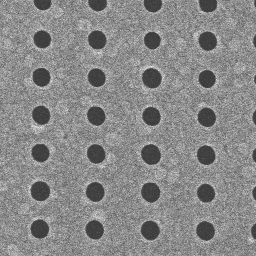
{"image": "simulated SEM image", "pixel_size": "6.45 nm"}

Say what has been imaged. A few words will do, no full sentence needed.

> a regular array of holes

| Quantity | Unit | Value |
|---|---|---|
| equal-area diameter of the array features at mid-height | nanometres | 118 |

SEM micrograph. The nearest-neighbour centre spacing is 244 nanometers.